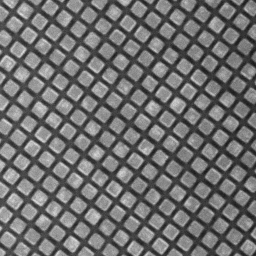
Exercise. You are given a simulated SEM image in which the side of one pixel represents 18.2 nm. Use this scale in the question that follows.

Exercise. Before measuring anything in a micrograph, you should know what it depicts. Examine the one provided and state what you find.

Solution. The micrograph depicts a regular array of raised bodies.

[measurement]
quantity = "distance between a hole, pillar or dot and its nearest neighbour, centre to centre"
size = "315 nanometers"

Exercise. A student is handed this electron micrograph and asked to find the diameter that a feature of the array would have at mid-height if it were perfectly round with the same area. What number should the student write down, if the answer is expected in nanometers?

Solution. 251